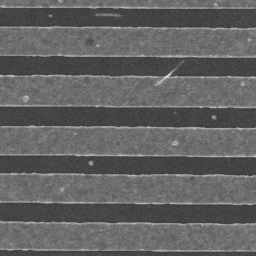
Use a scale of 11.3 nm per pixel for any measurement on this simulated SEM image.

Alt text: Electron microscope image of lines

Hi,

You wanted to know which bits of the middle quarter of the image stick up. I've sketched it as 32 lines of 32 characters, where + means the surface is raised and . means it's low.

................................
................................
................................
++++++++++++++++++++++++++++++++
++++++++++++++++++++++++++++++++
++++++++++++++++++++++++++++++++
++++++++++++++++++++++++++++++++
++++++++++++++++++++++++++++++++
++++++++++++++++++++++++++++++++
++++++++++++++++++++++++++++++++
..........++++++++++++++++++++++
................................
................................
................................
................................
................................
++++++++++++++++++++++++++++++++
++++++++++++++++++++++++++++++++
++++++++++++++++++++++++++++++++
++++++++++++++++++++++++++++++++
++++++++++++++++++++++++++++++++
++++++++++++++++++++++++++++++++
++++++++++++++++++++++++++++++++
................................
................................
................................
................................
................................
++++++++++++++++++++++++++++++++
++++++++++++++++++++++++++++++++
++++++++++++++++++++++++++++++++
++++++++++++++++++++++++++++++++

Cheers